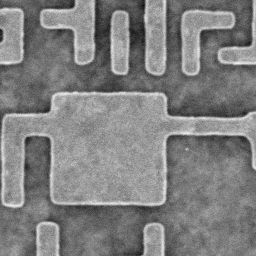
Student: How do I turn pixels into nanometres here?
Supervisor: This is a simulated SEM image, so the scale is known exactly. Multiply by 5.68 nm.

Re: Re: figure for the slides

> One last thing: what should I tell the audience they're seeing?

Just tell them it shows wiring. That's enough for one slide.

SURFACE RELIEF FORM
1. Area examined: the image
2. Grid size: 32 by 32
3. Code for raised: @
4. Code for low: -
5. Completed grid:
---------@@@------@@@-----------
@@@--@@@@@@@---@--@@@--@@@------
@@@--@@@@@@@--@@--@@@--@@@@@@---
@@@-----@@@@--@@--@@@--@@@@-----
-@@------@@@--@@--@@@--@@-------
@@@------@@@--@@--@@@--@@------@
@@@------@@@--@@--@@@--@@--@@@@@
@@@------@@---@@--@@@--@@--@@@@@
--------------@@--@@@--@@-------
--------------------------------
--------------------------------
--------------------------------
-------@@@@@@@@@@@@@@-----------
------@@@@@@@@@@@@@@@-----------
-@@@@@@@@@@@@@@@@@@@@----------@
@@@@@@@@@@@@@@@@@@@@@@@@@@@@@@@@
@@@@@@@@@@@@@@@@@@@@@@@@@@@@@@@@
@@@---@@@@@@@@@@@@@@@----------@
@@@---@@@@@@@@@@@@@@@-----------
@@@---@@@@@@@@@@@@@@@-----------
@@@---@@@@@@@@@@@@@@@-----------
@@@---@@@@@@@@@@@@@@@-----------
@@@---@@@@@@@@@@@@@@@-----------
@@@---@@@@@@@@@@@@@@@-----------
@@@---@@@@@@@@@@@@@@@-----------
-@@--------------@@@------------
--------------------------------
--------------------------------
-----@@-----------@@------------
-----@@-----------@@------------
-----@@-----------@@------------
-----@@-----------@@------------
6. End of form